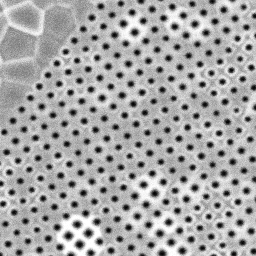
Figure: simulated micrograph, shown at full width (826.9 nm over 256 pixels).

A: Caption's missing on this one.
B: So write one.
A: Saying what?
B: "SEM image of a regular array of holes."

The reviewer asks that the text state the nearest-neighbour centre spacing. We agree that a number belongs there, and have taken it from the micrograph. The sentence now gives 45.6 nm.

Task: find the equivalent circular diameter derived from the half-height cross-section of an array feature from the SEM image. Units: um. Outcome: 0.0193